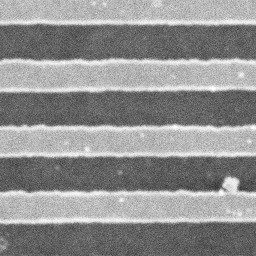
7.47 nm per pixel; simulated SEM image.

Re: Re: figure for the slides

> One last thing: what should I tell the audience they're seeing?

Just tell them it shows lines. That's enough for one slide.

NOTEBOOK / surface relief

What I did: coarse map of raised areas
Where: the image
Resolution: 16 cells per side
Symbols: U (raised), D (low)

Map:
UUUUUUUUUUUUUUUU
DDDDDUDDDDDDDDDD
DDDDDDDDDDDDDDDD
DDDDDDDDDDDDDDDD
UUUUUUUUUUUUUUUU
UUUUUUUUUUUUUUUU
DDDDDDDDDDDDDDDD
DDDDDDDDDDDDDDDD
UUUUUUUUUUUUUUUU
UUUUUUUUUUUUUUUU
DDDDDDDDDDDDDDDD
DDDDDDDDDDDDDDUD
UUUUUUUUUUUUUUUU
UUUUUUUUUUUUUUUU
DDDDDDDDDDDDDDDD
DDDDDDDDDDDDDDDD